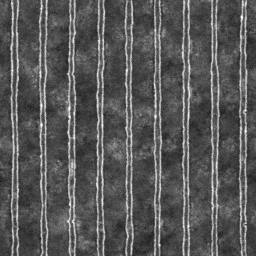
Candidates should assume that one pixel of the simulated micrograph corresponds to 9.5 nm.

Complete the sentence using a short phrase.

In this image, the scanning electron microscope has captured parallel lines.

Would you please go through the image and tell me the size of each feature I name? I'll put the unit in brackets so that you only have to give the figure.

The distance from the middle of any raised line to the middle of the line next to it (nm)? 271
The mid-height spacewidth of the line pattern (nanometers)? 217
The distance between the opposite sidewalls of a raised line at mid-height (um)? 0.0499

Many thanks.